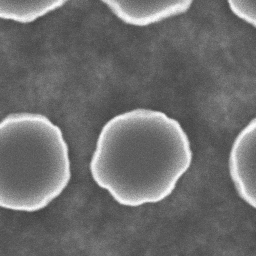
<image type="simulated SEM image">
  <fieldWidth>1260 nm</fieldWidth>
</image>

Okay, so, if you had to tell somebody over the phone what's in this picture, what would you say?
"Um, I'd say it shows raised bodies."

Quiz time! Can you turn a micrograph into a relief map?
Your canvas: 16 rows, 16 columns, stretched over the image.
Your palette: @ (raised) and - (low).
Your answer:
@@@----@@@@----@
----------------
----------------
----------------
----------------
----------------
----------------
-@@----@@@@-----
@@@@--@@@@@----@
@@@@--@@@@@@---@
@@@@--@@@@@@---@
@@@@--@@@@@----@
@@@-----@@------
----------------
----------------
----------------